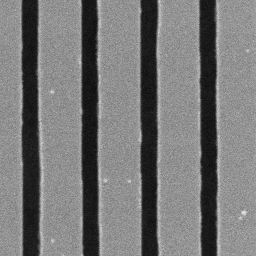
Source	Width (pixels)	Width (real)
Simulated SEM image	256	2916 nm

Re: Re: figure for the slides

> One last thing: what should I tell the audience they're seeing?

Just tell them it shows lines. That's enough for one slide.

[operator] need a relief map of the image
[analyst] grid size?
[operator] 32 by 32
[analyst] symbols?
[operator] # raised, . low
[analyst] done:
###..#####..#####...#####..#####
###..#####..######..#####..#####
###..#####..#####...#####..#####
###..#####..#####...#####..#####
###..#####..#####...#####..#####
###..#####..#####...#####..#####
###..#####..#####...#####..#####
###..#####..#####...#####..#####
###..#####..#####...#####..#####
###..#####..#####...#####..#####
###..#####..#####...#####..#####
###..#####..#####...#####..#####
###..#####..#####...#####..#####
###..#####..#####...#####..#####
###..#####..#####...#####..#####
###..#####..######..#####..#####
###..#####..######..#####..#####
###..#####..######..#####..#####
###..#####..#####...#####..#####
###..#####..#####...#####..#####
###..#####..#####...#####..#####
###..#####..######..#####..#####
###..#####..######..#####..#####
###..#####..######..#####..#####
###..#####..######..#####..#####
###..#####..######..#####..#####
###..#####..######..#####..#####
###..#####..######..#####..#####
###..#####..######..#####..#####
###..#####..######..#####..#####
###..#####..######..#####..#####
###..#####..######..#####..#####